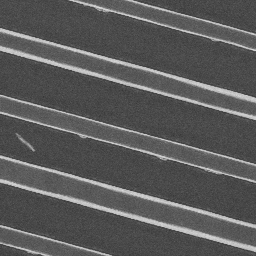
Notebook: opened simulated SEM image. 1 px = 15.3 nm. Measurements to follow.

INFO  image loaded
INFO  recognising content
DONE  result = lines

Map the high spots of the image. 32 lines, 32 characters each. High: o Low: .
..........oooooooo..............
..............oooooooo..........
..................ooooooo.......
.....................oooooooo...
ooo......................ooooooo
ooooooo......................ooo
.oooooooooo.....................
.....ooooooooo..................
.........ooooooooo..............
............oooooooooo..........
................ooooooooo.......
...................oooooooooo...
oo.....................ooooooooo
oooooo.....................ooooo
..oooooooo.....................o
.....oooooooo...................
.........oooooooo...............
............ooooooooo...........
................oooooooo........
....................oooooooo....
oooo...................ooooooooo
ooooooo....................ooooo
ooooooooooo....................o
...ooooooooooo..................
.......ooooooooooo..............
..........oooooooooooo..........
..............oooooooooooo......
..................ooooooooooo...
o.....................oooooooooo
ooooo....................ooooooo
ooooooooo....................ooo
....oooooooo....................